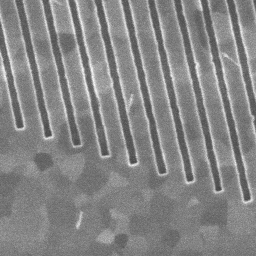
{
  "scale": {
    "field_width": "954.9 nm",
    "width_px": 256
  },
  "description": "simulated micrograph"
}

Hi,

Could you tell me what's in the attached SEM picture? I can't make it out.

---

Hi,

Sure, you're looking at parallel lines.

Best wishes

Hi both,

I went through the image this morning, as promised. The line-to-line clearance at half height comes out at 30.1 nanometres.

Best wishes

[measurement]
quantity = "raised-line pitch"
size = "25.8 px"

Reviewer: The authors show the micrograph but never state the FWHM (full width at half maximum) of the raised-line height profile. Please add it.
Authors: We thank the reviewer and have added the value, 66.5 nm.